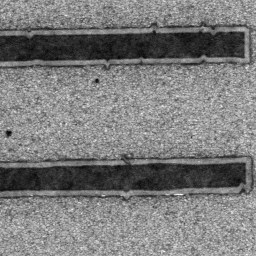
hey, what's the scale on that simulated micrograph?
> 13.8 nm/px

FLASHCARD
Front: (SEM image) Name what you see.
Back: one or a few lines or trenches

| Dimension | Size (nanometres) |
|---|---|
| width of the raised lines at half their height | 418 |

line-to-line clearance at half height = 1390 nanometres